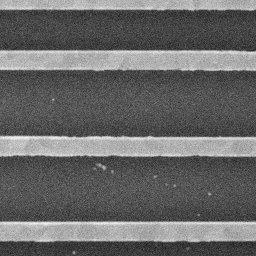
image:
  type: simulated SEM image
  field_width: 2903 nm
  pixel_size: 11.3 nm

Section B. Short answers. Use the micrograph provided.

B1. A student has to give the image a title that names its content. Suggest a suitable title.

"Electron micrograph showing lines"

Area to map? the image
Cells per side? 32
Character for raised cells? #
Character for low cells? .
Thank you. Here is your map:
################################
................................
................................
................................
................................
................................
##############################..
################################
################################
................................
................................
................................
................................
................................
................................
................................
................................
################################
################################
................................
................................
................................
................................
................................
................................
................................
................................
................................
################################
################################
................................
................................